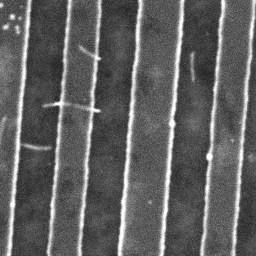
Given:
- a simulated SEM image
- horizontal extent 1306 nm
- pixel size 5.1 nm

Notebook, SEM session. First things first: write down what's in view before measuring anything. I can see lines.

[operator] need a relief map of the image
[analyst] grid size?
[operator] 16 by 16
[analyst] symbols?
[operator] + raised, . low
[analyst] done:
++..++...++...++
++..++...++...++
++..++...++...++
++..++...++...++
++..++..+++...++
+...++..+++..++.
+...++..+++..++.
+...++..+++..++.
+...++..+++..++.
+...++..+++..++.
+..++...+++..++.
+..++...+++..++.
+..++...++...++.
+..++...++...++.
+..++...++...++.
+..++..+++...++.